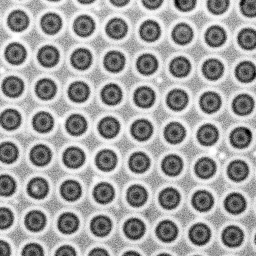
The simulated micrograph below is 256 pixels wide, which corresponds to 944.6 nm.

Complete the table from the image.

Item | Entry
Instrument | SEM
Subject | an array of small figures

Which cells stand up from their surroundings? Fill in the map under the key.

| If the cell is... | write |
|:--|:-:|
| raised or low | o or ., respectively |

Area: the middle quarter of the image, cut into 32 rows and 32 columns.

oo.....ooo.....ooo......oo......
ooo...oooo.....ooo......oo......
oooooooooooo.oooooo....oooo.....
oooooooooooooooooooooooooooo..oo
oo....oooooooooooooooooooooooooo
o.....oooo....ooooo..ooooooooooo
o......oo......oo......oooo...oo
o......oo......oo......oo......o
o.....ooo......oo......oo.......
oo....ooo.....ooo......oo......o
ooooooooooo..ooooo....oooo.....o
oooooooooooooooooooooooooo....oo
o....ooooooooooooooooooooooooooo
o.....ooo....oooooo.oooooooooooo
......oo......ooo.....oooo...ooo
......oo......oo......ooo.....oo
......oo......oo.......oo......o
o....oooo.....oo......ooo......o
ooooooooo....oooo.....ooo......o
ooooooooooooooooooo..oooo.....oo
o...oooooooooooooooooooooooooooo
.....oooo...oooooooooooooooooooo
......oo.....oooo....ooooo..oooo
......o.......oo......ooo.....oo
......o.......oo......oo......oo
.....ooo.....ooo......oo......oo
o..ooooo.....ooo.....ooo......oo
oooooooooooooooooo..ooooo....ooo
oooooooooooooooooooooooooooooooo
....oooo....oooooooooooooooooooo
.....oo......ooo....oooooo.ooooo
.....oo......oo......ooo.....ooo